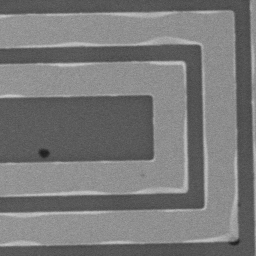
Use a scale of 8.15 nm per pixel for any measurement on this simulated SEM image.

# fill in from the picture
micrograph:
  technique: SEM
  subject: groups of lines, slits or small figures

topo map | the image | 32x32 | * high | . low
...............................*
...........................**..*
*****************************..*
*****************************..*
*****************************..*
*********..*******.......****..*
.........................****...
.........................****...
***********************..****...
***********************..****...
***********************..****...
***********************..****...
...................****...***...
...................****...***...
...................****...***...
...................****...***...
...................****...***...
...................****...***...
...................****...***...
...................****...***...
***********************...***...
***********************...***...
***********************...***...
***********************...***...
*.........................***...
..........................***...
.............****************...
*****************************...
*****************************...
*****************************...
*....***........................
................................